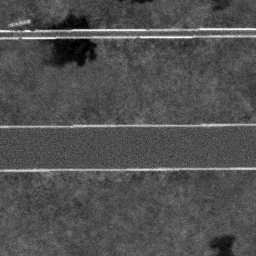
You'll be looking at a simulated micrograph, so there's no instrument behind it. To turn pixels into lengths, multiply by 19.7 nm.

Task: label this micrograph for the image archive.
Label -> lines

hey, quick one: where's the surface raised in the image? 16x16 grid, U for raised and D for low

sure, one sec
DDDDDDDDDDDDDDDD
DDDDDDDDDDDDDDDD
DDDDDDDDDDDDDDDD
DDDDDDDDDDDDDDDD
DDDDDDDDDDDDDDDD
DDDDDDDDDDDDDDDD
DDDDDDDDDDDDDDDD
DDDDDDDDDDDDDDDD
UUUUUUUUUUUUUUUU
UUUUUUUUUUUUUUUU
UUUUUUUUUUUUUUUU
DDDDDDDDDDDDDDDD
DDDDDDDDDDDDDDDD
DDDDDDDDDDDDDDDD
DDDDDDDDDDDDDDDD
DDDDDDDDDDDDDDDD